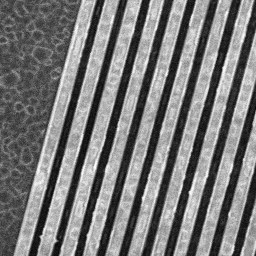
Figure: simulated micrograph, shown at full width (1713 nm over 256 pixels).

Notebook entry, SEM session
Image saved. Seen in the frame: parallel lines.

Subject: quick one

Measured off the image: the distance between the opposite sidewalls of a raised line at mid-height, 84 nm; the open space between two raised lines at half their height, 58.2 nm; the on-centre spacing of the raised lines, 146 nanometres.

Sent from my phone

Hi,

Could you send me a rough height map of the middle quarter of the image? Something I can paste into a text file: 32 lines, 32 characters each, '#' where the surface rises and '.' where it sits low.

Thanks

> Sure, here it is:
####..###..####..####..###...###
###...###..####..###...###..####
###..####..###...###..####..###.
###..####..###...###..###...###.
###..###..####..####..###...###.
##...###..####..###...###..####.
##..####..###...###..####..###..
##..####..###...###..###...###..
##..###..####..####..###...###..
#..####..####..###...###..####..
#..####..###...###..####..###...
#..####..###...###..###...###..#
...###..####..###...###..####..#
...###..###...###...###..###...#
..####..###...###..###...###..##
..###..####..####..###..####..##
..###..####..###...###..####..##
.####..###...###..####..###...##
.####..###...###..###...###..###
.###..####..####..###...###..###
.###..####..###...###..####..###
####..###...###..####..###...###
####..###...###..####..###..####
###..####..####..###...###..###.
###..####..###...###..####..###.
###..###...###..####..###...###.
###..###..####..####..###..###..
##..####..###...###..####..###..
##..###...###...###..###...###..
##..###...###..####..###..####..
#..####..####..###..####..####..
#..####..###...###..####..###...